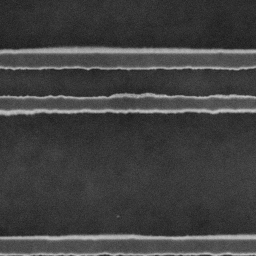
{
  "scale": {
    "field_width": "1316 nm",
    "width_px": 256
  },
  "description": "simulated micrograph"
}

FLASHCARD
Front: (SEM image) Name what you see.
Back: lines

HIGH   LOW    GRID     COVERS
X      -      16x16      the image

----------------
----------------
----------------
XXXXXXXXXXXXXXXX
XXXXXXXXXXXXXXXX
XXXXXXXXXXXXXXXX
XXXXXXXXXXXXXXXX
----------------
----------------
----------------
----------------
----------------
----------------
----------------
----------------
XXXXXXXXXXXXXXXX